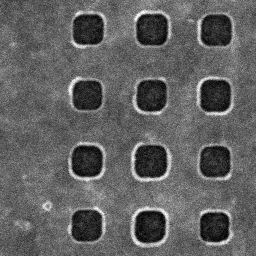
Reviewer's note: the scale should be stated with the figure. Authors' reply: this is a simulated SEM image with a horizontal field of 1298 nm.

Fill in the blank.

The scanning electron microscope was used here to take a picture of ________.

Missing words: a regular array of holes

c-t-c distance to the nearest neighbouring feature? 324 nm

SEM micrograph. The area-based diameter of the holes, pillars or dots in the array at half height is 175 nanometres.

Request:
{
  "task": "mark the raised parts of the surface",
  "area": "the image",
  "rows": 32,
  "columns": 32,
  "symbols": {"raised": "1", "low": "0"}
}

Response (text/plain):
11111111111111111111111111111111
11111111111111111111111111111111
11111111100001111000011110000111
11111111100001111000011110000111
11111111100001111000011110000111
11111111110011111100111110000111
11111111111111111111111111111111
11111111111111111111111111111111
11111111111111111111111111111111
11111111111111111111111111111111
11111111100001111000011110000111
11111111100001111000011110000111
11111111100001111000011110000111
11111111100011111000111110000111
11111111111111111111111111111111
11111111111111111111111111111111
11111111111111111111111111111111
11111111111111111111111111111111
11111111100011111000011110001111
11111111100001111000011110000111
11111111100001111000011110000111
11111111100001111000011110000111
11111111111111111111111111111111
11111111111111111111111111111111
11111111111111111111111111111111
11111111111111111111111111111111
11111111100011111100111111001111
11111111100001111000011110000111
11111111100001111000011110000111
11111111100001111000011110000111
11111111111111111111111111111111
11111111111111111111111111111111